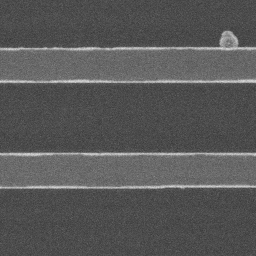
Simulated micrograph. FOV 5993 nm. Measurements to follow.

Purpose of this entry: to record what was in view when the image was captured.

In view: lines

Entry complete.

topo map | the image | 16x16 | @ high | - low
----------------
----------------
----------------
@@@@@@@@@@@@@@@@
@@@@@@@@@@@@@@@@
----------------
----------------
----------------
----------------
----------------
@@@@@@@@@@@@@@@@
@@@@@@@@@@@@@@@@
----------------
----------------
----------------
----------------